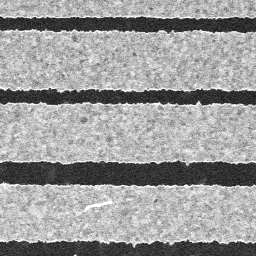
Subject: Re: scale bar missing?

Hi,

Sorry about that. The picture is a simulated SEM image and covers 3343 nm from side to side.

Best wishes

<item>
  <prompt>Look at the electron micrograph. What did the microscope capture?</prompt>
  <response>one or a few lines or trenches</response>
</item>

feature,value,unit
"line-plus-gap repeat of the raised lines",998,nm